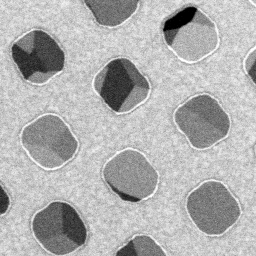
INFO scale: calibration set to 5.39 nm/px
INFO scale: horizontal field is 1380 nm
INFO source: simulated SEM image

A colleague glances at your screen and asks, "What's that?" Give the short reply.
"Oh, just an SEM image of raised bodies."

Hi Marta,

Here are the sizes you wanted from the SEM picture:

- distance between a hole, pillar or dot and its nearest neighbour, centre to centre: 464 nm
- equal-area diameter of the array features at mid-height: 289 nm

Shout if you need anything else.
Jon